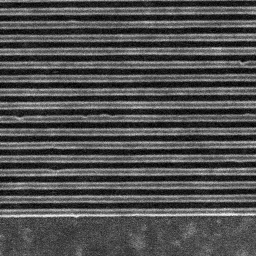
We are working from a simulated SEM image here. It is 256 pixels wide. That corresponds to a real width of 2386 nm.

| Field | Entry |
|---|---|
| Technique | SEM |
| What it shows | parallel lines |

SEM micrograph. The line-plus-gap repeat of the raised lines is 0.125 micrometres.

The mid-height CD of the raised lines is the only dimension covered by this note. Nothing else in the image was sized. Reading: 54.7 nm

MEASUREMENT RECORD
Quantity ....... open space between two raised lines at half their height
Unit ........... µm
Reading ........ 0.0722